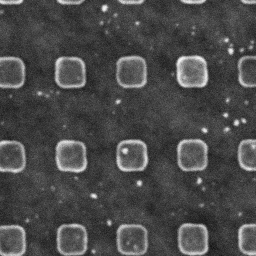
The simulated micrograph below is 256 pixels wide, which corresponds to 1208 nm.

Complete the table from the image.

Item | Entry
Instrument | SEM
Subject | a regular array of raised bodies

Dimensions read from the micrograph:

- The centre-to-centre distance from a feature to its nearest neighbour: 0.287 micrometres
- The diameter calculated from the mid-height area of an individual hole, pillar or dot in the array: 151 nanometers